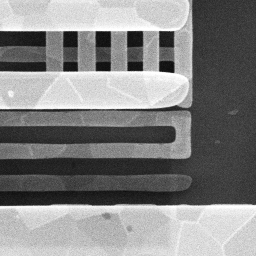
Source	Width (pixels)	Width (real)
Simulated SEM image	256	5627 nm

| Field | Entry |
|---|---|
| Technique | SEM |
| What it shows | wiring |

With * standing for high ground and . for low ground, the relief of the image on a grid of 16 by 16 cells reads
************....
***********.....
................
................
................
************....
***********.....
................
................
................
................
................
................
****************
****************
****************